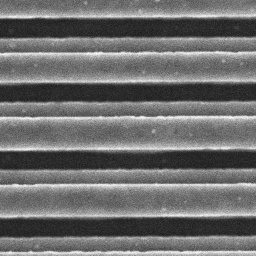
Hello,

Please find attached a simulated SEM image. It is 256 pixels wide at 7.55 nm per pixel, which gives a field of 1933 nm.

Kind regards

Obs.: lines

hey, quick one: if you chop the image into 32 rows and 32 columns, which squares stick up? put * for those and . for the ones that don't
********************************
********************************
................................
................................
................................
********************************
********************************
********************************
********************************
********************************
................................
................................
................................
********************************
********************************
********************************
********************************
********************************
********************************
................................
................................
********************************
********************************
********************************
********************************
********************************
********************************
................................
................................
................................
********************************
********************************